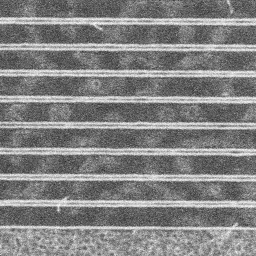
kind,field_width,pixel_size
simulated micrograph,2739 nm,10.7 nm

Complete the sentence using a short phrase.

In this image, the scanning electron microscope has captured parallel lines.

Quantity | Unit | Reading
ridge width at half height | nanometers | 45.5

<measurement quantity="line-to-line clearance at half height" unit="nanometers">231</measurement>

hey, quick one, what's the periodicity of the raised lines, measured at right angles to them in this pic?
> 278 nanometres